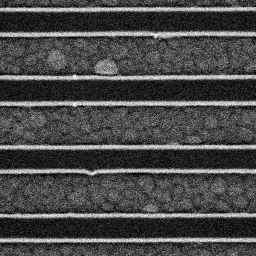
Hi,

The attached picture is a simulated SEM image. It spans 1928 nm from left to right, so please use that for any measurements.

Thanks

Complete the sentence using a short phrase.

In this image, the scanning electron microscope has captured one or a few lines or trenches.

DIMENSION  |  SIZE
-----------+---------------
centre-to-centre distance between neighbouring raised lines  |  0.517 um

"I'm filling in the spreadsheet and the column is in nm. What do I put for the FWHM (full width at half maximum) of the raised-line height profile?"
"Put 188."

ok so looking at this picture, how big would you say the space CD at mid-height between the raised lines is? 0.324 µm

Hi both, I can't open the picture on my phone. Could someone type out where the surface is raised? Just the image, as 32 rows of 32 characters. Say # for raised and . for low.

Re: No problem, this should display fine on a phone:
................................
################################
################################
################################
................................
................................
................................
................................
................................
................................
################################
################################
################################
................................
................................
................................
................................
................................
################################
################################
################################
...........#....................
................................
................................
................................
................................
................................
################################
################################
################################
................................
................................